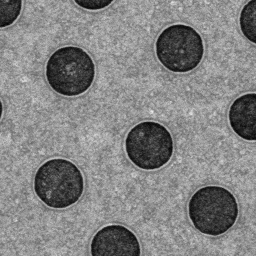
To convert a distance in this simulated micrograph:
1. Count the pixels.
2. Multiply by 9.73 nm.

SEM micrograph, holes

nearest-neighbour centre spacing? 953 nm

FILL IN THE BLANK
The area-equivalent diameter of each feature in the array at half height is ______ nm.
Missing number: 484